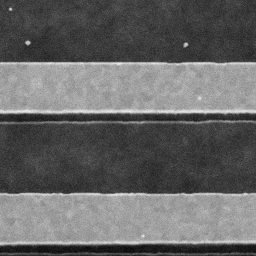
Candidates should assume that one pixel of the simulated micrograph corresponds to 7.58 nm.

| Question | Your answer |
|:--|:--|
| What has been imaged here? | lines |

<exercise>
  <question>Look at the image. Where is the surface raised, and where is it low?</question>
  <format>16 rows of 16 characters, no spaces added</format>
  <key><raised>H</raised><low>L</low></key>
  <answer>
LLLLLLLLLLLLLLLL
LLLLLLLLLLLLLLLL
LLLLLLLLLLLLLLLL
LLLLLLLLLLLLLLLL
HHHHHHHHHHHHHHHH
HHHHHHHHHHHHHHHH
HHHHHHHHHHHHHHHH
LLLLLLLLLLLLLLLL
LLLLLLLLLLLLLLLL
LLLLLLLLLLLLLLLL
LLLLLLLLLLLLLLLL
LLLLLLLLLLLLLLLL
HHHHHHHHHHHHHHHH
HHHHHHHHHHHHHHHH
HHHHHHHHHHHHHHHH
LLLLLLLLLLLLLLLL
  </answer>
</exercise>